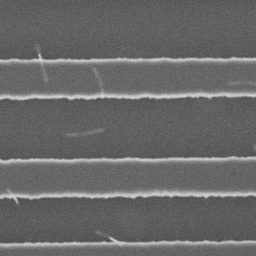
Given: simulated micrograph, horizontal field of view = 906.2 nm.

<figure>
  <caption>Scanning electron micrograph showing lines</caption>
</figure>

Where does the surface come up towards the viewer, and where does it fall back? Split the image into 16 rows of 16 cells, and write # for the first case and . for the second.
................
................
................
................
################
################
................
................
................
................
################
################
................
................
................
################